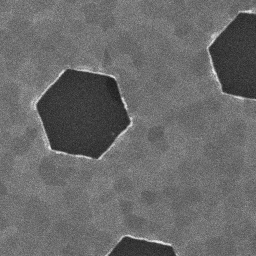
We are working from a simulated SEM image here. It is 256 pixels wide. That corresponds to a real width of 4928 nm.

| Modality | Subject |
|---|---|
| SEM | holes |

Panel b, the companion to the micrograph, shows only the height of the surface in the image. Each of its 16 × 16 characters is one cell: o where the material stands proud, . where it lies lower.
oooooooooooooooo
oooooooooooooo..
ooooooooooooo...
ooooooooooooo...
oooo..ooooooo...
ooo....ooooooo..
oo......oooooooo
ooo.....oooooooo
ooo....ooooooooo
oooo...ooooooooo
oooooooooooooooo
oooooooooooooooo
oooooooooooooooo
oooooooooooooooo
oooooooooooooooo
ooooooo....ooooo